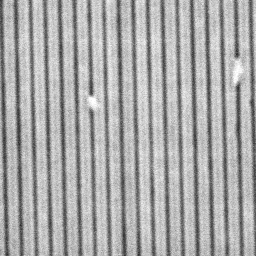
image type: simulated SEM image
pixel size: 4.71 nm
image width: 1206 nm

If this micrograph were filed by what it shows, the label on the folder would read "parallel lines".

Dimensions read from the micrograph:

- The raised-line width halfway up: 47.7 nm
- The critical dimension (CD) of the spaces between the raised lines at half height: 0.0212 um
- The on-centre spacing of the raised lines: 69.1 nanometers